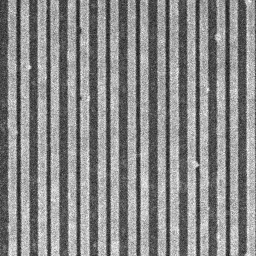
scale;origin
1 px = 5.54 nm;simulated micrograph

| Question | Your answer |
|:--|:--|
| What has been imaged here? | parallel lines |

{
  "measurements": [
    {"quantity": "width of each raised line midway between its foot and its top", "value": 42.9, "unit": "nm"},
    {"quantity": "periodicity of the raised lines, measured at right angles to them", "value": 82.6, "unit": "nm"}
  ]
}